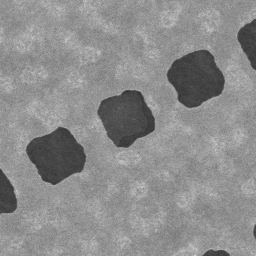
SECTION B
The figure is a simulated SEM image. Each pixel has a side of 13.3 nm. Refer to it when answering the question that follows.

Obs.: holes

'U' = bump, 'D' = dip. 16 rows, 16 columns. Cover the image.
UUUUUUUUUUUUUUUU
UUUUUUUUUUUUUUUD
UUUUUUUUUUUUUUUD
UUUUUUUUUUUDDUUD
UUUUUUUUUUUDDDUU
UUUUUUUUUUUDDDUU
UUUUUUDDDUUDDUUU
UUUUUUDDDDUUUUUU
UUUDDUUDDUUUUUUU
UUDDDUUUUUUUUUUU
UUDDDUUUUUUUUUUU
DUUUUUUUUUUUUUUU
DUUUUUUUUUUUUUUU
UUUUUUUUUUUUUUUU
UUUUUUUUUUUUUUUU
UUUUUUUUUUUUUUUU